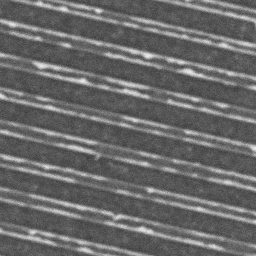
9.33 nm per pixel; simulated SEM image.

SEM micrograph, parallel lines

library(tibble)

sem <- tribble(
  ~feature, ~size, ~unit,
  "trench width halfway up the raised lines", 196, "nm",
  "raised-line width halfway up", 107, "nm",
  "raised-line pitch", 306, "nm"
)